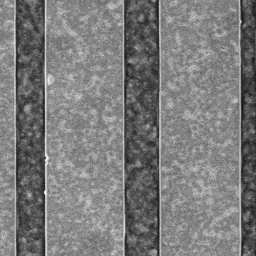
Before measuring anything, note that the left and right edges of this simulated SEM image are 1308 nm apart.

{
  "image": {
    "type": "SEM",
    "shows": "one or a few lines or trenches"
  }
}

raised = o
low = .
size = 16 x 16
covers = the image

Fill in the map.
o..ooooo..ooooo.
o..ooooo..ooooo.
o..ooooo..ooooo.
o..ooooo..ooooo.
o..ooooo..ooooo.
o..ooooo..ooooo.
o..ooooo..ooooo.
o..ooooo..ooooo.
o..ooooo..ooooo.
o..ooooo..ooooo.
o..ooooo..ooooo.
o..ooooo..ooooo.
o..ooooo..ooooo.
o..ooooo..ooooo.
o..ooooo..ooooo.
o..ooooo..ooooo.